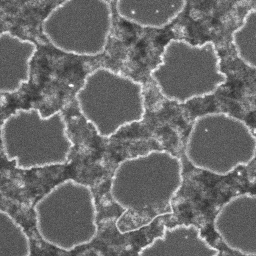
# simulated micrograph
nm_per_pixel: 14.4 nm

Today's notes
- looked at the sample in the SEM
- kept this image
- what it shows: raised bodies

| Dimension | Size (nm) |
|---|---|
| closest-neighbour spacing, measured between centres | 1200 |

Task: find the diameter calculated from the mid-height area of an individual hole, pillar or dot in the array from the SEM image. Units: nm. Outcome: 928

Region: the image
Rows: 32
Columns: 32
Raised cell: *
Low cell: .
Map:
........*****..********.........
......********.*******.........*
......********..*****..........*
.....*********................**
**....*******................***
****...******........***.**..***
****....*****.......*******...**
****................*******...**
****...............********.....
****.......****....*********....
***........******...********....
.*........********..*******.....
..........********....**........
..........********..............
.****.**...*******.......****...
********....****........*******.
********....**..........*******.
*********...............********
.********..............*********
.*******..........****.*********
..*****........********.*******.
..............*********....**...
..............*********.........
.......****...********..........
......******..********........**
.....*******...******.......****
.....*******...******......*****
**...*******...****........*****
***..*******...***....***..*****
***..*******........*****...****
****...***.........*******..****
****..............*********...**